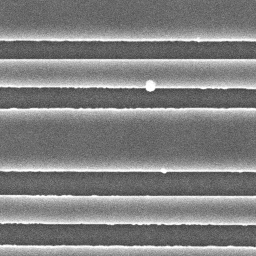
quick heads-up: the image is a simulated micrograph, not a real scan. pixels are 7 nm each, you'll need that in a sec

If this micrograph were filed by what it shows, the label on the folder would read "lines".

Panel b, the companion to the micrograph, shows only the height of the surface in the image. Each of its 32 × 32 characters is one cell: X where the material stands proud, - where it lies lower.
XXXXXXXXXXXXXXXXXXXXXXXXXXXXXXXX
XXXXXXXXXXXXXXXXXXXXXXXXXXXXXXXX
XXXXXXXXXXXXXXXXXXXXXXXXXXXXXXXX
XXXXXXXXXXXXXXXXXXXXXXXXXXXXXXXX
XXXXXXXXXXXXXXXXXXXXXXXXXXXXXXXX
--------------------------------
--------------------------------
--------------------------------
XXXXXXXXXXXXXXXXXXXXXXXXXXXXXXXX
XXXXXXXXXXXXXXXXXXXXXXXXXXXXXXXX
XXXXXXXXXXXXXXXXXXXXXXXXXXXXXXXX
--------------------------------
--------------------------------
--------------------------------
XXXXXXXXXXXXXXXXXXXXXXXXXXXXXXXX
XXXXXXXXXXXXXXXXXXXXXXXXXXXXXXXX
XXXXXXXXXXXXXXXXXXXXXXXXXXXXXXXX
XXXXXXXXXXXXXXXXXXXXXXXXXXXXXXXX
XXXXXXXXXXXXXXXXXXXXXXXXXXXXXXXX
XXXXXXXXXXXXXXXXXXXXXXXXXXXXXXXX
XXXXXXXXXXXXXXXXXXXXXXXXXXXXXXXX
--------------------------------
--------------------------------
--------------------------------
XXXXXXXXX--X--------------------
XXXXXXXXXXXXXXXXXXXXXXXXXXXXXXXX
XXXXXXXXXXXXXXXXXXXXXXXXXXXXXXXX
XXXXXXXXXXXXXXXXXXXXXXXXXXXXXXXX
--------------------------------
--------------------------------
--------------------------------
XXXXXXXXXXXXXXXXXXXXXXXXXXXXXXXX